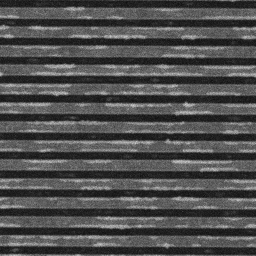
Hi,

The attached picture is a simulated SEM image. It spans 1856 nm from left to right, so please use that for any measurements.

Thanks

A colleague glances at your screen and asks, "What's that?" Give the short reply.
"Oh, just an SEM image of parallel lines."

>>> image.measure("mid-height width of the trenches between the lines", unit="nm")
62.6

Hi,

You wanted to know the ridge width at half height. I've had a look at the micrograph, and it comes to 76.2 nm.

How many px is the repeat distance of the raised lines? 19